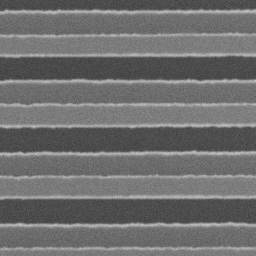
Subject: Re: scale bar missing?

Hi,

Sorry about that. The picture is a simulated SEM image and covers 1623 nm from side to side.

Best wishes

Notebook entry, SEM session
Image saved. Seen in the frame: lines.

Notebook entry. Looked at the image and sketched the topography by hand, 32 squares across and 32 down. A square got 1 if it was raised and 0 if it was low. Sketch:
00000000000000000000000000000000
11111111111111111111111111111111
11111111111111111111111111111111
11111111111111111111111111111111
11111111111111111111111111111111
11111111111111111111111111111111
11111111111111111111111111111111
00000000000000000000000000000000
00000000000000000000000000000000
00000000000000000000000000000000
11111111111111111111111111111111
11111111111111111111111111111111
11111111111111111111111111111111
11111111111111111111111111111111
11111111111111111111111111111111
11111111111111111111111111111111
00000000000000000000000000000000
00000000000000000000000000000000
00000000000000000000000000000000
11111111111111111111111111111111
11111111111111111111111111111111
11111111111111111111111111111111
11111111111111111111111111111111
11111111111111111111111111111111
11111111111111111111111111111111
00000000000000000000000000000000
00000000000000000000000000000000
00000000000000000000000000000000
11111111111111111111111111111111
11111111111111111111111111111111
11111111111111111111111111111111
11111111111111111111111111111111